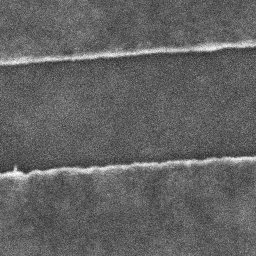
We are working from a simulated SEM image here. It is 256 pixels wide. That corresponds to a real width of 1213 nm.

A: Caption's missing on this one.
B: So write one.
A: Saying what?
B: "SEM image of one or a few lines or trenches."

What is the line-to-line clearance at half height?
0.531 micrometres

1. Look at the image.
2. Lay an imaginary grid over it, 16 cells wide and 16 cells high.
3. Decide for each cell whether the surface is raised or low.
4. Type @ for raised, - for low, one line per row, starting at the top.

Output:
@@@@@@@@@@@@@@@@
@@@@@@@@@@@@@@@@
@@@@@@@@@@@@@@@@
@@@@@@----------
----------------
----------------
----------------
----------------
----------------
----------------
-------@@@@@@@@@
@@@@@@@@@@@@@@@@
@@@@@@@@@@@@@@@@
@@@@@@@@@@@@@@@@
@@@@@@@@@@@@@@@@
@@@@@@@@@@@@@@@@